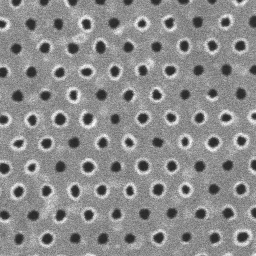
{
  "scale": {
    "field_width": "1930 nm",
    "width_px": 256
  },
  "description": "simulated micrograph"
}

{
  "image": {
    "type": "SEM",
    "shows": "a regular array of holes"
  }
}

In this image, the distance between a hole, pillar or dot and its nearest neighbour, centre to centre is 205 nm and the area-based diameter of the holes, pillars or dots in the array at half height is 0.0838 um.